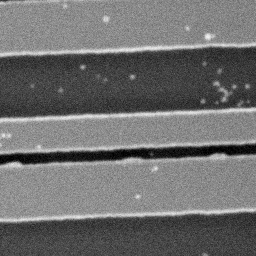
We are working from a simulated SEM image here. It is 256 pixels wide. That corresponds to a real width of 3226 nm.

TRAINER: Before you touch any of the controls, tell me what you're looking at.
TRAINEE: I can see lines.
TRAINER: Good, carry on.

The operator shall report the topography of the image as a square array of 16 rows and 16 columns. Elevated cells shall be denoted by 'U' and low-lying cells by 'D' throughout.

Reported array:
UUUUUUUUUUUUUUUU
UUUUUUUUUUUUUUUU
UUUUUUUUUUUUUUUU
DDDDDDDDDDDDDDDD
DDDDDDDDDDDDDDDD
DDDDDDDDDDDDDDDD
DDDDDDDDDDDDDDDD
DUUUUUUUUUUUUUUU
UUUUUUUUUUUUUUUU
UUUUUUUUUUUUUUUU
UUUUUUUUUUUUUUUU
UUUUUUUUUUUUUUUU
UUUUUUUUUUUUUUUU
UUUUUUDDDDDDDDDD
DDDDDDDDDDDDDDDD
DDDDDDDDDDDDDDDD